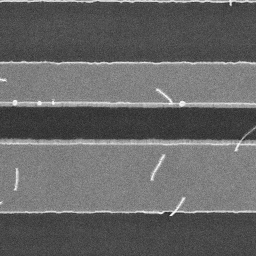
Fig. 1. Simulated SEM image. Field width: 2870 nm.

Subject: lines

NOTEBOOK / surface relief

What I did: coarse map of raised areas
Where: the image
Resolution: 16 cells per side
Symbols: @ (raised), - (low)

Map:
----------------
----------------
----------------
----------------
@@@@@@@@@@@@@@@@
@@@@@@@@@@@@@@@@
@@@@--@@@@@@@@@@
----------------
----------------
@@@@@@@@@@@@@@@@
@@@@@@@@@@@@@@@@
@@@@@@@@@@@@@@@@
@@@@@@@@@@@@@@@@
----------------
----------------
----------------